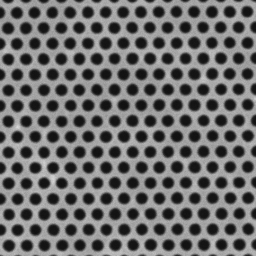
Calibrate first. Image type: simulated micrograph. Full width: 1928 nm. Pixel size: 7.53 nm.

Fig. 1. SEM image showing a regular array of holes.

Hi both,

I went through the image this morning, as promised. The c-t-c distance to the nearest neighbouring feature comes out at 131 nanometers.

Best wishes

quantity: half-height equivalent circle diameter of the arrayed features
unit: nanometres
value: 90.7